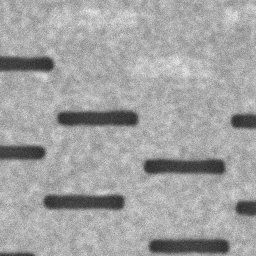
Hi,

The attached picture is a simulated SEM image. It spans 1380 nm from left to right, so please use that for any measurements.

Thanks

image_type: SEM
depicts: holes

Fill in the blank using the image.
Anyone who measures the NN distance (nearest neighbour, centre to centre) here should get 0.444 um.